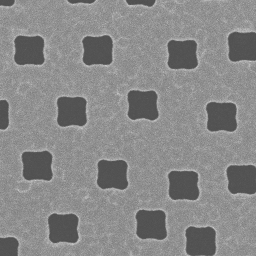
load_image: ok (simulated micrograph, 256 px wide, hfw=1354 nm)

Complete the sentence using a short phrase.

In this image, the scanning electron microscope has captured a regular array of holes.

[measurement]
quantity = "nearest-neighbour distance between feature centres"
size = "0.342 micrometres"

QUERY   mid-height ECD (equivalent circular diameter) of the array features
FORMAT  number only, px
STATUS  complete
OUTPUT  32.3